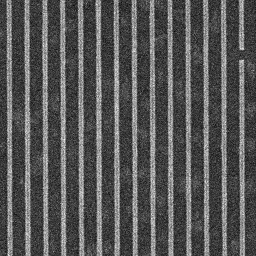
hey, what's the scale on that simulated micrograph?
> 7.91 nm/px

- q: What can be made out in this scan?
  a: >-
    parallel lines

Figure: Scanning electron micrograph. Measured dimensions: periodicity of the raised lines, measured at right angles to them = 17.9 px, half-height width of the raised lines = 29.7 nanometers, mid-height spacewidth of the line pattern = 111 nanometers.